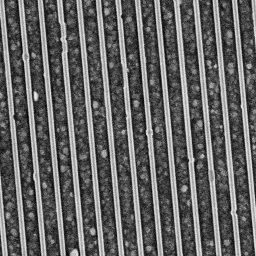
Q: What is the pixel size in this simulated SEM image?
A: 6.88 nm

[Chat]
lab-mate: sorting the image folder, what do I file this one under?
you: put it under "parallel lines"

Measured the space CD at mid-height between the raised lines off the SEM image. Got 0.107 microns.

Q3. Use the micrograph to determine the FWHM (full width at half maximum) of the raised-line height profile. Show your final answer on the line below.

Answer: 26.5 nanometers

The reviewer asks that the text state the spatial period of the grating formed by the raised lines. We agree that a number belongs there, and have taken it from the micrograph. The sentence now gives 133 nm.